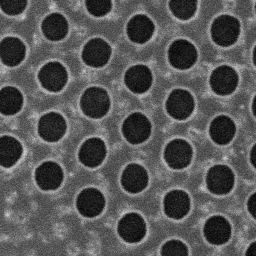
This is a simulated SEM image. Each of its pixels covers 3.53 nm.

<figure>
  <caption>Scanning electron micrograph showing a regular array of holes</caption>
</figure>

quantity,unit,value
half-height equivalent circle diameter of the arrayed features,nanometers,109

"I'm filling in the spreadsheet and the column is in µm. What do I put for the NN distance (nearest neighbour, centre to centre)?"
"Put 0.172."